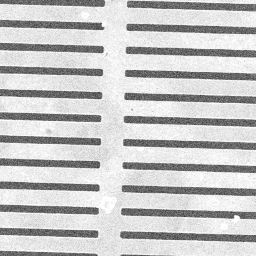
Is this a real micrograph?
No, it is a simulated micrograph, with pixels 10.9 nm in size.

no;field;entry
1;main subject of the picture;groups of lines, slits or small figures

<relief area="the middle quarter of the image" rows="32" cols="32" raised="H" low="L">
HHHHHHHHHHHHHHHHHHHHHHHHHHHHHHHH
LLLLLLLLLLHHHHHHLLLLLLLLLLLLHHHH
LLLLLLLLLLHHHHHLLLLLLLLLLLLLLLLL
HHHHHHHHHHHHHHHHHHLLLLLLLLLLLLLL
HHHHHHHHHHHHHHHHHHHHHHHHHHHHHHHH
HHHHHHHHHHHHHHHHHHHHHHHHHHHHHHHH
HHHHHHHHHHHHHHHHHHHHHHHHHHHHHHHH
LLLLLLLLLLHHHHHLLLLLLLLLLLLLLLLL
LLLLLLLLLHHHHHHLLLLLLLLLLLLLLLLL
HHHHHHHHHHHHHHHHHHHHHHHHLLLLLLLL
HHHHHHHHHHHHHHHHHHHHHHHHHHHHHHHH
HHHHHHHHHHHHHHHHHHHHHHHHHHHHHHHH
LLLLLLLHHHHHHHHHHHHHHHHHHHHHHHHH
LLLLLLLLLLHHHHHLLLLLLLLLLLLLLLLL
LLLLLLLLLHHHHHHLLLLLLLLLLLLLLLLL
HHHHHHHHHHHHHHHHHHHHHHHHHHHHHHHH
HHHHHHHHHHHHHHHHHHHHHHHHHHHHHHHH
HHHHHHHHHHHHHHHHHHHHHHHHHHHHHHHH
LLLLLLLLLHHHHHHHHHHHHHHHHHHHHHHH
LLLLLLLLLHHHHHLLLLLLLLLLLLLLLLLL
HHHHHHHLLHHHHHHLLLLLLLLLLLLLLLLL
HHHHHHHHHHHHHHHHHHHHHHHHHHHHHHHH
HHHHHHHHHHHHHHHHHHHHHHHHHHHHHHHH
HHHHHHHHHHHHHHHHHHHHHHHHHHHHHHHH
LLLLLLLLLHHHHHHLLLLLLLLHHHHHHHHH
LLLLLLLLLHHHHHLLLLLLLLLLLLLLLLLL
HHHHHHHHHHHHHHHHLLLLLLLLLLLLLLLL
HHHHHHHHHHHHHHHHHHHHHHHHHHHHHHHH
HHHHHHHHHHHHHHHHHHHHHHHHHHHHHHHH
HHHHHHHHHHHHHHHHHHHHHHHHHHHHHHHH
LLLLLLLLLHHHHHHLLLLLLLLLLLLLLHHH
LLLLLLLLLHHHHHLLLLLLLLLLLLLLLLLL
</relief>